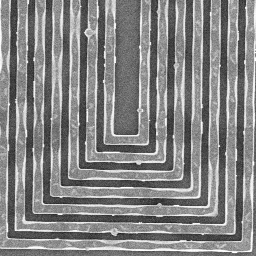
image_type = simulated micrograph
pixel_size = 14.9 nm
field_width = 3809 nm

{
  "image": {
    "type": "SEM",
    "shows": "groups of lines, slits or small figures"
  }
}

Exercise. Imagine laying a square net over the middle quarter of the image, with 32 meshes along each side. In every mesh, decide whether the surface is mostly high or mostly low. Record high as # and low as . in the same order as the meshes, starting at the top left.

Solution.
..##..##..###......##...##..##..
..##..##..###......##..###..##..
..##..##..###......##..###..##..
..##..##..###......##..###..##..
..##..##..###......##..##...##..
..##..##..###......##..##...##..
..##..##..###......##..##...##..
..##..##..##.......##..##...##..
..##..##..##.......##...#...##..
..##..##..##.......##...#...##..
..##..##..##.......##...#...##..
..##..##..##......###..##...##..
..##..##..##.......##..##...##..
..##..##..##.......##..##...##..
..##..##..##.......##..##...##..
..##..##..##.......##..##...##..
..##..##..##.......##..##...##..
..##..##..##......###..##...##..
..##..##..###########..##...##..
..#...##..###########..##...##..
..#...##...............##...##..
..#...##...............##...##..
..#...###################...##..
..#...###################...##..
.##...............##........##..
.###........................##..
.######....................###..
.#############################..
..###########################...
................................
................................
########################.......#